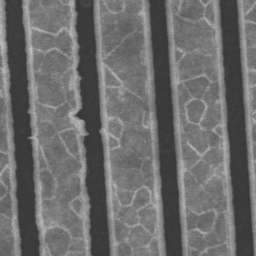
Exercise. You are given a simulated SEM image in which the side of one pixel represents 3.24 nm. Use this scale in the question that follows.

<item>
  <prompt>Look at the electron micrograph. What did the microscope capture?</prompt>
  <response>one or a few lines or trenches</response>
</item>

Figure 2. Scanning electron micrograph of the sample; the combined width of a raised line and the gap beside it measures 233 nm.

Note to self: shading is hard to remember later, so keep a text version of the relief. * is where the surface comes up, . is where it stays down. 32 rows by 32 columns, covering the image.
...******...******...******...**
...******...******...******...**
...******...******...******...**
...******...******...******...**
...******...******...******...**
*..*******..*******..******...**
*...******..*******..*******..**
*...******..*******..*******..**
*...*****...*******..*******..**
*...******...******...******...*
*...******...******...******...*
*...******...******...******...*
*...******...******...******...*
*...******...******...******...*
*...*****....******...******...*
*...******...******...******...*
*...******...******...******...*
*...******...******...******...*
*...******...******...******...*
*...******...******...******...*
**..*******..*******..******...*
**..*******..*******..******...*
**..*******..*******..*******..*
**...*****....******...******...
**...******...******...******...
**...******...******...******...
**...******...******...******...
**...******...******...******...
**...******...******...******...
**...******...******...******...
**...******...******...******...
**...******...******...******...